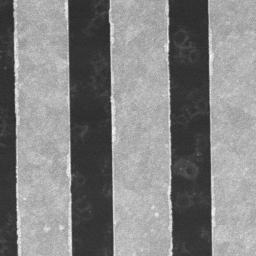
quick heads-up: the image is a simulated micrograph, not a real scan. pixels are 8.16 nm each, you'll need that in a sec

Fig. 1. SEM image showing one or a few lines or trenches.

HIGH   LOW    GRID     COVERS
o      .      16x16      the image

.ooo...ooo...ooo
.ooo...ooo...ooo
.ooo...ooo...ooo
.ooo...ooo...ooo
.ooo...oooo..ooo
.ooo...oooo..ooo
.ooo...oooo..ooo
.ooo...oooo..ooo
.ooo...oooo..ooo
.ooo...oooo..ooo
.ooo...ooooo.ooo
.ooo...oooo..ooo
.ooo...oooo..ooo
.ooo...oooo..ooo
.ooo...oooo..ooo
.ooo...oooo..ooo